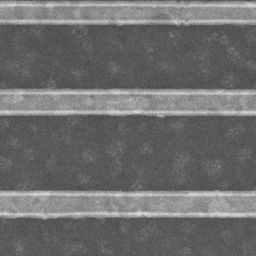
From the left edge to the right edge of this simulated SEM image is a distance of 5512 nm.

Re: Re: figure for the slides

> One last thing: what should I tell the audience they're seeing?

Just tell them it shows one or a few lines or trenches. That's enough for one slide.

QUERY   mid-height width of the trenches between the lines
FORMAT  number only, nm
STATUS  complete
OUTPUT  1680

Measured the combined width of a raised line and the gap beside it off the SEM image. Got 2060 nanometers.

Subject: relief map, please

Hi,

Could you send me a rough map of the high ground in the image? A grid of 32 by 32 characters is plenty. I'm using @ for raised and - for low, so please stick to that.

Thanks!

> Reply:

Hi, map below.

--------------------------------
@@@@@@@@@@@@@@@@@@@@@@@@@@@@@@@@
@@@@@@@@@@@@@@@@@@@@@@@@@@@@@@@@
--------------------------------
--------------------------------
--------------------------------
--------------------------------
--------------------------------
--------------------------------
--------------------------------
--------------------------------
--------------------------------
@@@@@@@@@@@@@@@@@@@@@@@@@@@@@@@@
@@@@@@@@@@@@@@@@@@@@@@@@@@@@@@@@
--------------------------------
--------------------------------
--------------------------------
--------------------------------
--------------------------------
--------------------------------
--------------------------------
--------------------------------
--------------------------------
--------------------------------
@@@@@@@@@@@@@@@@@@@@@@@@@@@@@@@@
@@@@@@@@@@@@@@@@@@@@@@@@@@@@@@@@
@@@@@@@@@@@@@@@@@@@@@@@@@@@@@@@@
--------------------------------
--------------------------------
--------------------------------
--------------------------------
--------------------------------